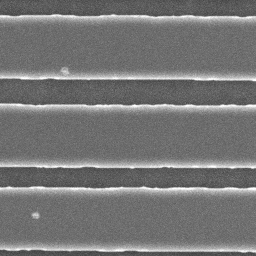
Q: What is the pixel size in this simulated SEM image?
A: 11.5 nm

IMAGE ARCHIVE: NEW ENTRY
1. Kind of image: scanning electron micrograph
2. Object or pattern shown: lines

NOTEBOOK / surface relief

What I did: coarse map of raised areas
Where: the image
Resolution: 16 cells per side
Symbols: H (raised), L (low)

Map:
LLLLLLLLLLLLLLLL
HHHHHHHHHHHHHHHH
HHHHHHHHHHHHHHHH
HHHHHHHHHHHHHHHH
HHHHHHHHHHHHHHHH
LLLLLLLLLLLLLLLL
LLLLLLLLLLLLLLLL
HHHHHHHHHHHHHHHH
HHHHHHHHHHHHHHHH
HHHHHHHHHHHHHHHH
LLLLLLLLLLLLLLLL
LLLLLLLLLLLLLLLL
HHHHHHHHHHHHHHHH
HHHHHHHHHHHHHHHH
HHHHHHHHHHHHHHHH
HHHHHHHHHHHHHHHH